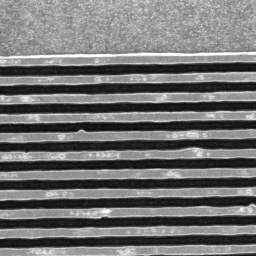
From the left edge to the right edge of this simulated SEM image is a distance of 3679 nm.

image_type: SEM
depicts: parallel lines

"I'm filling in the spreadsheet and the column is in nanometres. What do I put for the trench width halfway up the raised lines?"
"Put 131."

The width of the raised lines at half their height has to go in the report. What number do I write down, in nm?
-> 144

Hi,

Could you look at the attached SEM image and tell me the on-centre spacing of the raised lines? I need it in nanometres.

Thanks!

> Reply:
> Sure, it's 275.